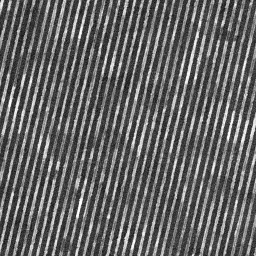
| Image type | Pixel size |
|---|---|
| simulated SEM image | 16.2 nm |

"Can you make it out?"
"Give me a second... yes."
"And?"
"parallel lines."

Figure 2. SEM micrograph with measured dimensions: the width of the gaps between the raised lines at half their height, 0.0886 micrometres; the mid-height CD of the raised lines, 33.5 nm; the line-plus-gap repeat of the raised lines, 123 nanometers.